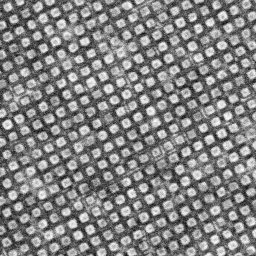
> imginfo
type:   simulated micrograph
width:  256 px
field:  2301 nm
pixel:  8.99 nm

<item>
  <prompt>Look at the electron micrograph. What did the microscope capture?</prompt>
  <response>a regular array of raised bodies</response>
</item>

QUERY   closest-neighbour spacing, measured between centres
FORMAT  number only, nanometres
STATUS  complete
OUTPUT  116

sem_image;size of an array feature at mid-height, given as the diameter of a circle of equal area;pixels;7.9